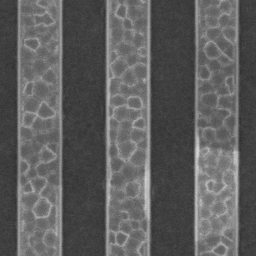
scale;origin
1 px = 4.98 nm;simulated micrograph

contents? one or a few lines or trenches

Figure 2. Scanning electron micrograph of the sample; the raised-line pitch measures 440 nm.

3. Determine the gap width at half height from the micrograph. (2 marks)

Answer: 0.233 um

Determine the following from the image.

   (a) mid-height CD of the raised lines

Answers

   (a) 209 nm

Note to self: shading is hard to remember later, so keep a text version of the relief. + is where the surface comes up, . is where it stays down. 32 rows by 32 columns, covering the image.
..++++++.....++++++......+++++..
..++++++.....++++++......+++++..
..++++++.....++++++......+++++..
..++++++.....++++++......+++++..
..++++++.....++++++......+++++..
..++++++.....++++++......+++++..
..++++++.....++++++......+++++..
..++++++.....++++++......+++++..
..++++++......+++++......+++++..
..++++++.....++++++......+++++..
..++++++.....++++++......+++++..
..++++++.....++++++......+++++..
..++++++.....++++++......+++++..
..++++++.....++++++......+++++..
..++++++.....++++++......+++++..
..++++++.....++++++......+++++..
..++++++......+++++......+++++..
..++++++......+++++.....++++++..
..++++++......+++++.....++++++..
..++++++......+++++.....++++++..
..++++++......+++++......+++++..
..++++++......+++++.....++++++..
..++++++......+++++......+++++..
..++++++......+++++......+++++..
..++++++......+++++......+++++..
..++++++......+++++......+++++..
..++++++.....++++++......+++++..
..++++++.....++++++......+++++..
..++++++.....++++++......+++++..
..++++++.....++++++......+++++..
..++++++.....++++++......+++++..
..++++++.....++++++......+++++..